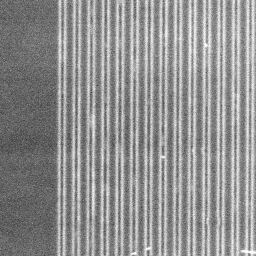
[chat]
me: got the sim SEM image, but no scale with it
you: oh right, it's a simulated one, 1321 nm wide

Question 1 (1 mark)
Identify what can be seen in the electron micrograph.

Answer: parallel lines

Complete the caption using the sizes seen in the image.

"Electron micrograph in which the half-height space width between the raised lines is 17.4 nanometers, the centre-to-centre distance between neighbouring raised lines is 0.0747 um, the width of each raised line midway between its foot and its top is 10.6 px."